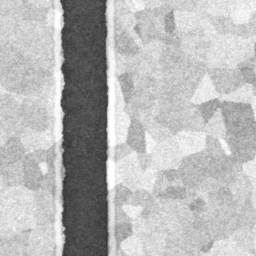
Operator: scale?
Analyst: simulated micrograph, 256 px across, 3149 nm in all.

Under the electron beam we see one or a few lines or trenches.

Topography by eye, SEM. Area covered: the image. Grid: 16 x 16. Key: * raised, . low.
****...*********
****...*********
****...*********
****...*********
****...*********
****...*********
****...*********
****...*********
****...*********
****...*********
****...*********
****...*********
****...*********
****...*********
****...*********
****...*********